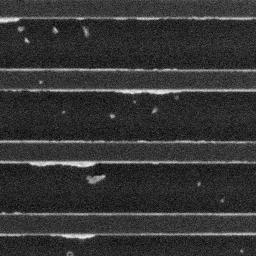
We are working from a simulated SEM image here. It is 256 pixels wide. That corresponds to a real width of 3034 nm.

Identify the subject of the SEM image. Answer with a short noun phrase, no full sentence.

lines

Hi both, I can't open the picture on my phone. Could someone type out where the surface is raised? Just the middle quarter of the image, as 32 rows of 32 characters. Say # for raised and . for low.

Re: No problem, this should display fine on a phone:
................................
################..##..#.#####...
################################
################################
################################
################################
#######.########################
................................
................................
................................
................................
................................
................................
................................
................................
................................
................................
................................
................................
######..##..#.....##........####
################################
################################
################################
################################
################################
................................
................................
................................
................................
................................
................................
................................